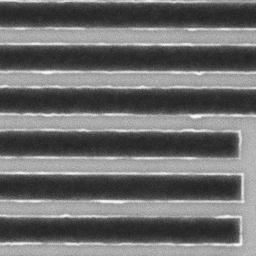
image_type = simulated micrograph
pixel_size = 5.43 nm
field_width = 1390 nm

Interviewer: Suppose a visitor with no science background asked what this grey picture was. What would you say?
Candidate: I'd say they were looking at parallel lines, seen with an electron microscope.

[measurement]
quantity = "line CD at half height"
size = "157 nanometres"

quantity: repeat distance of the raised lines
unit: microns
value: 0.233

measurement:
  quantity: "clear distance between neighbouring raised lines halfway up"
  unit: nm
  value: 78